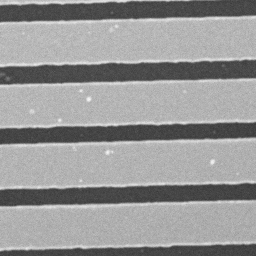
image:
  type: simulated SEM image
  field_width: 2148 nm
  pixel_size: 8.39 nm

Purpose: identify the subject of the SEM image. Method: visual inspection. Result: lines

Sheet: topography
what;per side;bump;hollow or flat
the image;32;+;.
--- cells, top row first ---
+.+.............................
................................
............++++++++++++++++++++
++++++++++++++++++++++++++++++++
++++++++++++++++++++++++++++++++
++++++++++++++++++++++++++++++++
++++++++++++++++++++++++++++++++
++++++++++++++++++++++++++++++..
................................
................................
.......+++++++++++++++++++++++++
++++++++++++++++++++++++++++++++
++++++++++++++++++++++++++++++++
++++++++++++++++++++++++++++++++
++++++++++++++++++++++++++++++++
+++++++++++++++++..+............
................................
.....................+++++++++++
++++++++++++++++++++++++++++++++
++++++++++++++++++++++++++++++++
++++++++++++++++++++++++++++++++
++++++++++++++++++++++++++++++++
++++++++++++++++++++++++++++++++
++++++++........................
................................
...............+++++++++++++++++
++++++++++++++++++++++++++++++++
++++++++++++++++++++++++++++++++
++++++++++++++++++++++++++++++++
++++++++++++++++++++++++++++++++
++++++++++++++++++++++++++++....
................................